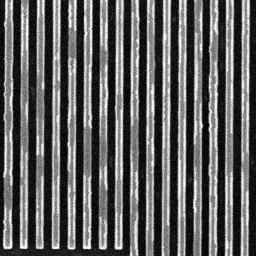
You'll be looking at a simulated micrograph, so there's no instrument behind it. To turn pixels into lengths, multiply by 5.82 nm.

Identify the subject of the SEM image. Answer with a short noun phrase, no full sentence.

parallel lines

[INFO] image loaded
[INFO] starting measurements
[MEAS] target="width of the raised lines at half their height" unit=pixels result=6.99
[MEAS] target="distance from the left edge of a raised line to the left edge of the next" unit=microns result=0.0918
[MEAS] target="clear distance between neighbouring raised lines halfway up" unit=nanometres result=52.3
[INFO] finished